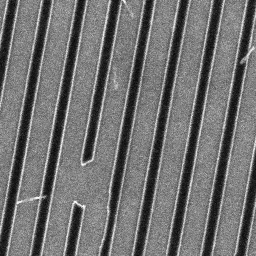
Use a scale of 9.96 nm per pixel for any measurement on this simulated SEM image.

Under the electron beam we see parallel lines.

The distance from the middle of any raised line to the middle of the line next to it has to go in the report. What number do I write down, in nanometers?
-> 335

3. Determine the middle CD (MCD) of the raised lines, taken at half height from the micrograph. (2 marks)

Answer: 11.6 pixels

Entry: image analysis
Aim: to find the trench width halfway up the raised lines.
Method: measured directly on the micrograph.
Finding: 219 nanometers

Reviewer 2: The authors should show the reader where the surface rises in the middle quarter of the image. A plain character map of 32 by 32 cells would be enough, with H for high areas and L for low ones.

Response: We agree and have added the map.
HHHLLLLLHHHLLLLLLHHHLLLLLLHHHLLL
HHHLLLLLHHHLLLLLLHHHLLLLLLHHLLLL
HHHLLLLLHHHLLLLLLHHHLLLLLHHHLLLL
HHLLLLLLHHHLLLLLHHHLLLLLLHHHLLLL
HHLLLLLLHHHLLLLLHHHLLLLLLHHHLLLL
HHLLLLLLHHHLLLLLHHHLLLLLLHHHLLLL
HHLLLLLHHHLLLLLLHHHLLLLLLHHLLLLL
HHLLLLLHHHLLLLLLHHHLLLLLHHHLLLLL
HHLLLLLHHHLLLLLLHHHLLLLLHHHLLLLL
HLLLLLLHHHLLLLLHHHLLLLLLHHHLLLLL
HLLLLLLHHHLLLLLHHHLLLLLLHHHLLLLL
HLLLLLLHHLLLLLLHHHLLLLLLHHHLLLLL
HLLLLLLHHLLLLLLHHHLLLLLLHHLLLLLL
HLLLLLHHHLLLLLLHHHLLLLLHHHLLLLLL
LLLLLLHHHLLLLLHHHLLLLLLHHHLLLLLL
LLLLLLHHHLLLLLHHHLLLLLLHHHLLLLLL
LLLLLLHHHLLLLLHHHLLLLLLHHHLLLLLH
LLLLLLHHLLLLLLHHHLLLLLLHHLLLLLLH
LLLLLHHHLLLLLLHHHLLLLLHHHLLLLLLH
LLLLLHHHLLLLLLHHHLLLLLHHHLLLLLLH
LLLLLHHHLLLLLHHHLLLLLLHHHLLLLLLH
LLLLLHHHLLLLLHHHLLLLLLHHHLLLLLHH
LLLLHHHHLLLLLHHHLLLLLLHHHLLLLLHH
LLLLHHHLLLLLLHHHLLLLLLHHLLLLLLHH
LLLLHHLLLLLLLHHHLLLLLHHHLLLLLLHH
LLLLLLLLLLLLHHHLLLLLLHHHLLLLLLHH
LLLLLLLLLLLLHHHLLLLLLHHHLLLLLLHH
LLLLLLLLLLLLHHHLLLLLLHHHLLLLLHHH
LLLLLLLLLLLLHHHLLLLLLHHLLLLLLHHH
LLLLLLLLLLLLHHHLLLLLHHHLLLLLLHHH
LLLLLLLLLLLLHHHLLLLLHHHLLLLLLHHH
LLLLLLLLLLLHHHLLLLLLHHHLLLLLLHHL